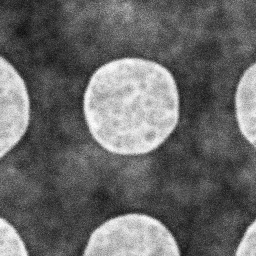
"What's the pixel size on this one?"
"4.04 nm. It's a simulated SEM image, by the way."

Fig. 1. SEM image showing raised bodies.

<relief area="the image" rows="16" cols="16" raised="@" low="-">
----------------
----------------
----------------
----------------
@-----@@@@-----@
@@----@@@@@----@
@@---@@@@@@----@
@@---@@@@@@----@
@-----@@@@-----@
-------@@-------
----------------
----------------
----------------
--------@-------
@-----@@@@@----@
@@---@@@@@@----@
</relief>